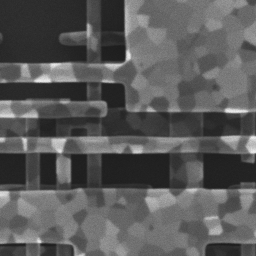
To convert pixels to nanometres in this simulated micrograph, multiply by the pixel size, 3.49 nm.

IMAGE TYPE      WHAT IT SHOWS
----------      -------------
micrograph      wiring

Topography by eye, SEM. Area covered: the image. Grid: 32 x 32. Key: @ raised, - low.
-----------@@---@@@@@@@@@@@@@@@@
-----------@@---@@@@@@@@@@@@@@@@
-----------@@---@@@@@@@@@@@@@@@@
-----------@@---@@@@@@@@@@@@@@@@
-----------@@---@@@@@@@@@@@@@@@@
-----------@@---@@@@@@@@@@@@@@@@
-----------@@---@@@@@@@@@@@@@@@@
-----------@@---@@@@@@@@@@@@@@@@
@@@@@@@@@@@@@@@@@@@@@@@@@@@@@@@@
@@@@@@@@@@@@@@@@@@@@@@@@@@@@@@@@
-----------@@--@@@@@@@@@@@@@@@@@
-----------@@---@@@@@@@@@@@@@@@@
---@@@@@@--@@---@@@@@@@@@@@@@@@@
@@@@@@@@@@@@@---@@@@@@@@@@@@@@@@
@@@@@@@@@@@@@--------@@@@-----@@
---@@--@@@@@@--------@@@@-----@@
---@@--@@--@@--------@@@@-----@@
@@@@@@@@@@@@@@@@@@@@@@@@@@@@@@@@
@@@@@@@@@@@@@@@@@@@@@@@@@@@@@@@@
---@@--@@--@@--------@@@@-----@@
---@@--@@--@@--------@@@@-------
---@@--@@--@@--------@@@@-------
---@@--@@--@@--------@@@@-------
---@@--@@-@@@--------@@@@@----@@
@@@@@@@@@@@@@@@@@@@@@@@@@@@@@@@@
@@@@@@@@@@@@@@@@@@@@@@@@@@@@@@@@
@@@@@@@@@@@@@@@@@@@@@@@@@@@@@@@@
@@@@@@@@@@@@@@@@@@@@@@@@@@@@@@@@
@@@@@@@@@@@@@@@@@@@@@@@@@@@@@@@@
@@@@@@@@@@@@@@@@@@@@@@@@@@@@@@@@
---@@--@@@@@@@@@@@@@@@@@@@----@@
---@@--@@@@@@@@@@@@@@@@@@@----@@